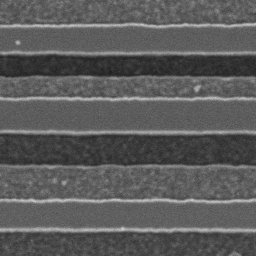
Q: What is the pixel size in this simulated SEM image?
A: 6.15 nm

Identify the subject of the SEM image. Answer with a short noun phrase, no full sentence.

lines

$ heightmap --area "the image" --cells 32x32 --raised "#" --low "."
################################
################################
################################
################################
################################
################################
################################
................................
................................
................................
################################
################################
################################
################################
################################
################################
........######################.#
................................
................................
................................
................................
################################
################################
################################
################################
################################
################################
################################
################################
................................
................................
................................